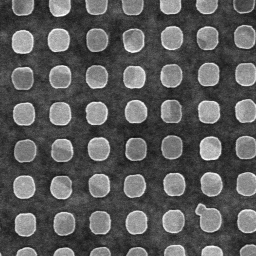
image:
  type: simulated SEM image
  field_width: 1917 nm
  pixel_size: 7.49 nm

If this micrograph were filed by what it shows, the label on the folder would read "a regular array of raised bodies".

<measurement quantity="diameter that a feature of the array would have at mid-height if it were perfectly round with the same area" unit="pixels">23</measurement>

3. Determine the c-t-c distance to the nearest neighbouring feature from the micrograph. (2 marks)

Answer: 35.8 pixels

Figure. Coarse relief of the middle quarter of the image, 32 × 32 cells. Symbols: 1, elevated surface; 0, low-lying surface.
00000001100000000000000001111000
10000011111000011111000011111000
11000011111000011111000011111100
11000011111000011111000011111100
11000011111000011111000011111000
10000011110000011111000001110000
00000000000000000000000000000000
00000000000000000000000000000000
00001000000000000000000000000000
00000000000000001110000001110000
10000011110000001111000011111000
10000011111000011111100011111000
11000011111000011111100011111000
11000011111000001111000011111000
10000011110000001110000000111000
00000000000000000000000000000000
01000000000000000000000000000000
10000000000000000000000000000000
00000000000000000000000001111000
10000011111000001111000001111000
11000011111000001111100011111000
11000011111000001111000011111000
11000011111000011111000001111000
11000001111000001111000001110000
00000000000000000000000000000000
00000000000000000000000000000000
00000000100000000000000000000000
00000000000000000000000000111000
10000001111000001111000001111100
11000011111000011111000001111100
11000011111000011111000001111100
11000011111000011111000001111100